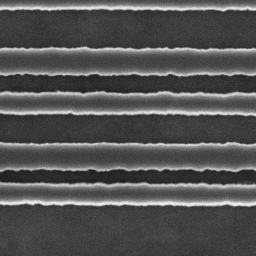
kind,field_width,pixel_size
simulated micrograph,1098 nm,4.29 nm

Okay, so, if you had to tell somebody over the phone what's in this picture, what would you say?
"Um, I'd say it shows lines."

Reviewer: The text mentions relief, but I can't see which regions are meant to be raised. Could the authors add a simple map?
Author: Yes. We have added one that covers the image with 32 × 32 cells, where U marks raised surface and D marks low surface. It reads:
UUUUUUUUUUUUUUUUUUUUUUUUUUUUUUUU
DDDDDDDDDDDDDDDDDDDDDDDDDDDDDDDD
DDDDDDDDDDDDDDDDDDDDDDDDDDDDDDDD
DDDDDDDDDDDDDDDDDDDDDDDDDDDDDDDD
DDDDDDDDDDDDDDDDDDDDDDDDDDDDDDDD
DDDDDDDDDDDDDDDDDDDDDDDDDDDDDDDD
UUUUUUUUUUUUUUUUUUUUUUUUUUUUUUUU
UUUUUUUUUUUUUUUUUUUUUUUUUUUUUUUU
UUUUUUUUUUUUUUUUUUUUUUUUUUUUUUUU
DDDDDDDDDDDDDDDDDDDDDDUDDDDDDDDD
DDDDDDDDDDDDDDDDDDDDDDDDDDDDDDDD
DDDDDDDDDDDDDDDDDDDDDDDDDDDDDDDD
UUUUUUUUUUUUUUUUUUUUUUUUUUUUUUUU
UUUUUUUUUUUUUUUUUUUUUUUUUUUUUUUU
DDDDDDDDDDDDDDDDDDDDDDDDDDDDDDDD
DDDDDDDDDDDDDDDDDDDDDDDDDDDDDDDD
DDDDDDDDDDDDDDDDDDDDDDDDDDDDDDDD
DDDDDDDDDDDDDDDDDDDDDDDDDDDDDDDD
UUUUUUUUUUUUUUUUUUUUUUUUUUUUUUUU
UUUUUUUUUUUUUUUUUUUUUUUUUUUUUUUU
UUUUUUUUUUUUUUUUUUUUUUUUUUUUUUUU
DDDDDDDDDDDDDDDDDDDDDDDDDDDDDDDD
DDDDDDDDDDDDDDDDDDDDDDDDDDDDDDDD
UUUUUUUUUUUUUUUUUUUUUUUUUUUUUUUU
UUUUUUUUUUUUUUUUUUUUUUUUUUUUUUUU
DDDDDDDDDDDUUDDDDUUDDDUUUUUUDUUU
DDDDDDDDDDDDDDDDDDDDDDDDDDDDDDDD
DDDDDDDDDDDDDDDDDDDDDDDDDDDDDDDD
DDDDDDDDDDDDDDDDDDDDDDDDDDDDDDDD
DDDDDDDDDDDDDDDDDDDDDDDDDDDDDDDD
DDDDDDDDDDDDDDDDDDDDDDDDDDDDDDDD
DDDDDDDDDDDDDDDDDDDDDDDDDDDDDDDD